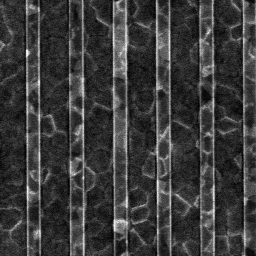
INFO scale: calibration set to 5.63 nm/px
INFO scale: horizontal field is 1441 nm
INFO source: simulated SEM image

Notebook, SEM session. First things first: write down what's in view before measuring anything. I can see parallel lines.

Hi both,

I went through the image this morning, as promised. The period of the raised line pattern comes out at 245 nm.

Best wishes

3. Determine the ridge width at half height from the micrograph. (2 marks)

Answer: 74.6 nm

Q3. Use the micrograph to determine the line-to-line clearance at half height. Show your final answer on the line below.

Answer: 170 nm